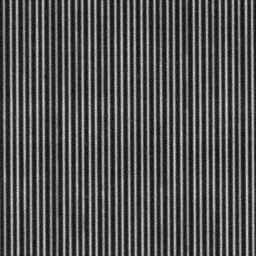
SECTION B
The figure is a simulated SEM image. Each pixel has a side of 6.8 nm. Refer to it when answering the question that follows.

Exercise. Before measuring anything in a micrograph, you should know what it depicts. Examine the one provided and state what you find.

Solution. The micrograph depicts parallel lines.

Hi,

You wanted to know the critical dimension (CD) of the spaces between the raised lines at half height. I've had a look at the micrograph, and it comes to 36.5 nm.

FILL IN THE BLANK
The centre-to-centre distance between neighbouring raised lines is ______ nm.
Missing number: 44.4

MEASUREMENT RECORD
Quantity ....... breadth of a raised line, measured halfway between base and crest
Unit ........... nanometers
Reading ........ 9.3